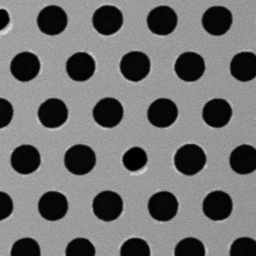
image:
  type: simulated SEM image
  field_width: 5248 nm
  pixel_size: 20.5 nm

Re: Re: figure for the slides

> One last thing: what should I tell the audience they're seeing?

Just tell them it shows a regular array of holes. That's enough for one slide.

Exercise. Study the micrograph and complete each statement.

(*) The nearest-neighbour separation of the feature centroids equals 1100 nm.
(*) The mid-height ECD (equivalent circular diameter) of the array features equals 626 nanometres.